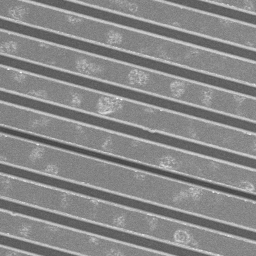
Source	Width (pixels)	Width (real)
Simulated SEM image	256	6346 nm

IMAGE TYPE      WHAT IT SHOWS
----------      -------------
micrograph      parallel lines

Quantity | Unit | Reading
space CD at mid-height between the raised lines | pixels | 11.5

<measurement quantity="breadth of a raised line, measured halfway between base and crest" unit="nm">572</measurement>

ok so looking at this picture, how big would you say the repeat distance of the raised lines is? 34.7 px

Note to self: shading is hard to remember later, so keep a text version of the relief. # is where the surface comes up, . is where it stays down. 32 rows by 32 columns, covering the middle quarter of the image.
##################...........###
######################..........
...#######################......
.......######################...
..........######################
###...........##################
#######...........##############
###########..........###########
###############..........#######
###################..........###
######################..........
...#######################......
.......#######################..
...........#####################
###...........##################
#######...........##############
###########..........###########
##############............######
##################...........###
######################..........
....#####################.......
.......######################...
####.......#####################
########.......#################
###########.......##############
###############.......##########
###################.......######
#######################.......##
##########################......
..############################..
......##########################
..........######################